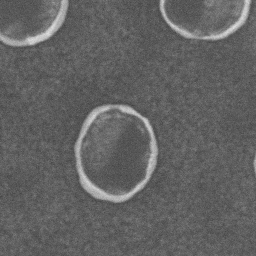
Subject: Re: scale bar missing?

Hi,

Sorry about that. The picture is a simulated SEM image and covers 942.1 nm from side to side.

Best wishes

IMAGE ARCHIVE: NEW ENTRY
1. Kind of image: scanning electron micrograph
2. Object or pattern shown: raised bodies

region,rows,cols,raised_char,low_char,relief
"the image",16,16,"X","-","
XXXX------XXXXXX
XXXX-------XXXX-
XXX-------------
----------------
----------------
----------------
----------------
------XXX-------
-----XXXXX------
-----XXXXX------
-----XXXXX------
-----XXXX-------
----------------
----------------
----------------
----------------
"